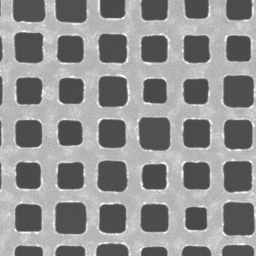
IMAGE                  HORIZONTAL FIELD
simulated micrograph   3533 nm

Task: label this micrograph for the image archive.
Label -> a regular array of holes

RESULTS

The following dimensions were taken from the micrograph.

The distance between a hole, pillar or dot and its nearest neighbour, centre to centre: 0.573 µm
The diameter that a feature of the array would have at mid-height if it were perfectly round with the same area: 418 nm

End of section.